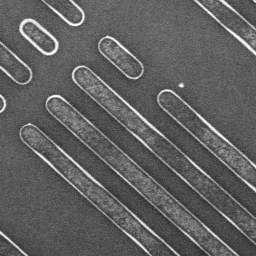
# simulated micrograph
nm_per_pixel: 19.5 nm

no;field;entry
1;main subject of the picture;groups of lines, slits or small figures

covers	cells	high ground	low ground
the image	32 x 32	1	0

00000011100000000000000001110000
00000001110000000000000000111100
00000000110000000000000000011110
00011000000000000000000000001111
00011100000000000000000000000111
00001110000011100000000000000001
10000110000001110000000000000000
11000000000000111000000000000000
11110000001000011100000000000000
01110000011100001000000000000000
00000000001110000000000000000000
00000000000111000000110000000000
00000011000011100000111000000000
00000011100001110000111100000000
00000001110000111100011110000000
00000000111000011110000111000000
00011000011110001111000011100000
00011100001111000011100001110000
00001110000111100001110000111000
00000111000011110000111000011110
00000011110001111000011100001111
00000001111000011100001110000111
00000000111100001110000111100011
00000000011110000111000011110000
00000000000111000011100001111000
00000000000011100001111000111100
00000000000001110000111100011110
00000000000000111000011110000111
00000000000000011100001111000011
10000000000000001111000011100001
11000000000000000111100001110000
11100000000000000011110000111000